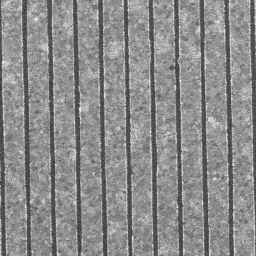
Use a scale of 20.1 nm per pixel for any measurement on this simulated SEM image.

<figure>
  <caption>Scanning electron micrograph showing parallel lines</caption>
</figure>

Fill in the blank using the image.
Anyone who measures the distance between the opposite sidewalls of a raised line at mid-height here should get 0.399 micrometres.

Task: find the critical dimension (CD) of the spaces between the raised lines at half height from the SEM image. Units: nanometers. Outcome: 103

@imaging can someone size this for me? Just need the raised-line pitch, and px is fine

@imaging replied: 25.3